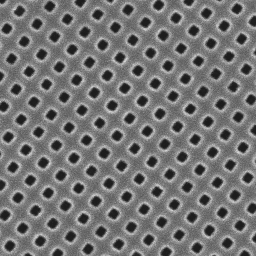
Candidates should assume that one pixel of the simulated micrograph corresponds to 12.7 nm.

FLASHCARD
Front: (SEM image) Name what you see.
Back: a regular array of holes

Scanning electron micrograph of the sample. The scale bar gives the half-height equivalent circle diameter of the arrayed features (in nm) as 133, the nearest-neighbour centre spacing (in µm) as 0.273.